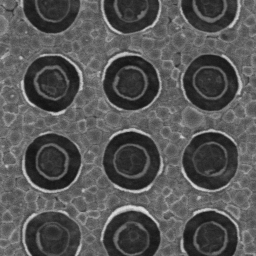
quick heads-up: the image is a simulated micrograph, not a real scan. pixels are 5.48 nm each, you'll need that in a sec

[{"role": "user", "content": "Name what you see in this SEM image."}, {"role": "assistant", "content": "ring-shaped grooves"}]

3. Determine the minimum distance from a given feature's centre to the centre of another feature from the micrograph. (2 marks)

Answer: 0.427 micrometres